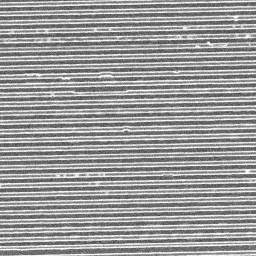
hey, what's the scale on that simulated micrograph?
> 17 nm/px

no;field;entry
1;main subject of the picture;parallel lines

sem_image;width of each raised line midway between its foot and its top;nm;61.7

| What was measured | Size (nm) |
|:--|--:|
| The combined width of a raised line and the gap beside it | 154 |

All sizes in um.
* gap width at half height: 0.0915